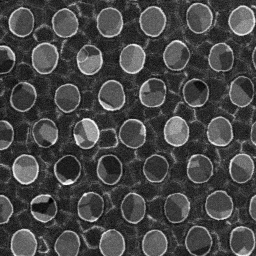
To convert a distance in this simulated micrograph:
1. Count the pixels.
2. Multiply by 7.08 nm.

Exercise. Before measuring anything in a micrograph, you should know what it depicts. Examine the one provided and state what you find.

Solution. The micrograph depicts a regular array of raised bodies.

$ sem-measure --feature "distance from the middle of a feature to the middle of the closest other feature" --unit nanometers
294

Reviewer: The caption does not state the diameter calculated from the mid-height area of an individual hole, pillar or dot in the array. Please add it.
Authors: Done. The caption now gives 0.191 um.